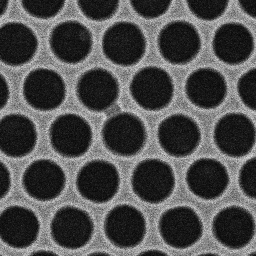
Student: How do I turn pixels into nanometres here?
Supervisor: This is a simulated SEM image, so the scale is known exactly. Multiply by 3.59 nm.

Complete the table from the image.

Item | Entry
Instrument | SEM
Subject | a regular array of holes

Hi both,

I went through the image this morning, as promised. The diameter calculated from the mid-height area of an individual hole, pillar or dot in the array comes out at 41.5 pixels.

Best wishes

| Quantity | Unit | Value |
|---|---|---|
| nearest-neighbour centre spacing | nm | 188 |